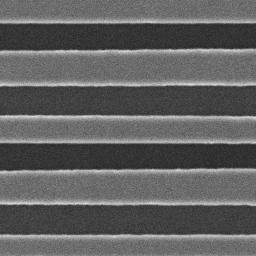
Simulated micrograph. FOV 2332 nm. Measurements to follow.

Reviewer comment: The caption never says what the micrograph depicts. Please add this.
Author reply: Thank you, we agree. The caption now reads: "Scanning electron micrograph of lines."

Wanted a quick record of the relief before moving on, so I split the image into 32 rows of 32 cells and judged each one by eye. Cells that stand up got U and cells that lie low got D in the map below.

UUUUUUUUUUUUUUUUUUUUUUUUUUUUUUUU
UUUUUUUUUUUUUUUUUUUUUUUUUUUUUUUU
UUUUUUUUUUUUUUUUUUUUUUUUUUUUUUUU
DDDDDDDDDDDDDDDDDDDDDDDDDDDDDDDD
DDDDDDDDDDDDDDDDDDDDDDDDDDDDDDDD
DDDDDDDDDDDDDDDDDDDDDDDDDDDDDDDD
UUUUUUUUUUUUUUUUUUUUUUUUUUUUUUUU
UUUUUUUUUUUUUUUUUUUUUUUUUUUUUUUU
UUUUUUUUUUUUUUUUUUUUUUUUUUUUUUUU
UUUUUUUUUUUUUUUUUUUUUUUUUUUUUUUU
UUUUUUUUUUUUUUUUUUUUUUUUUUUUUUUU
DDDDDDDDDDDDDDDDDDDDDDDDDDDDDDDD
DDDDDDDDDDDDDDDDDDDDDDDDDDDDDDDD
DDDDDDDDDDDDDDDDDDDDDDDDDDDDDDDD
DDDDDDDDDDDDDDDDDDDDDDDDDDDDDDDD
UUUUUUUUUUUUUUUUUUUUUUUUUUUUUUUU
UUUUUUUUUUUUUUUUUUUUUUUUUUUUUUUU
UUUUUUUUUUUUUUUUUUUUUUUUUUUUUUUU
DDDDDDDDDDDDDDDDDDDDDDDDDDDDDDDD
DDDDDDDDDDDDDDDDDDDDDDDDDDDDDDDD
DDDDDDDDDDDDDDDDDDDDDDDDDDDDDDDD
UUUUUUUUUUUUUUUUUUUUUUUUUUUUUUUU
UUUUUUUUUUUUUUUUUUUUUUUUUUUUUUUU
UUUUUUUUUUUUUUUUUUUUUUUUUUUUUUUU
UUUUUUUUUUUUUUUUUUUUUUUUUUUUUUUU
DDDDDDDDDDDDDDDDDDDDDUDDDDDUDDDU
DDDDDDDDDDDDDDDDDDDDDDDDDDDDDDDD
DDDDDDDDDDDDDDDDDDDDDDDDDDDDDDDD
DDDDDDDDDDDDDDDDDDDDDDDDDDDDDDDD
UUUUUUUUUUUUUUUUUUUUUUUUUUUUUUUU
UUUUUUUUUUUUUUUUUUUUUUUUUUUUUUUU
UUUUUUUUUUUUUUUUUUUUUUUUUUUUUUUU